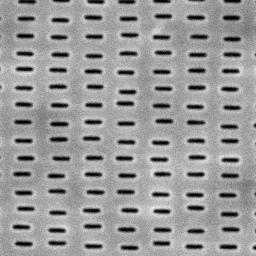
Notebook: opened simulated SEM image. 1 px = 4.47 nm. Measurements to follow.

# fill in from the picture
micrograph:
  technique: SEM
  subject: a regular array of holes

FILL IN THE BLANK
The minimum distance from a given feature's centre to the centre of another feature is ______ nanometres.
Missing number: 72.5